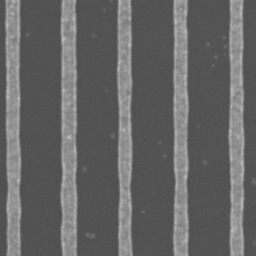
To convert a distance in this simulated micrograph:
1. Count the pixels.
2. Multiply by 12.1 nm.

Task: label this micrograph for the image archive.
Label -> wiring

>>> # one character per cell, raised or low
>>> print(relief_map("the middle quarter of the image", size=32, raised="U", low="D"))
UUUDDDDDDDDDDDUUUDDDDDDDDDDDUUUD
UUUDDDDDDDDDDDUUUDDDDDDDDDDDUUUD
UUUDDDDDDDDDDDUUUDDDDDDDDDDDUUUD
UUUDDDDDDDDDDDUUUDDDDDDDDDDDUUDD
UUUDDDDDDDDDDDUUUDDDDDDDDDDDUUDD
UUUDDDDDDDDDDDUUUDDDDDDDDDDDUUDD
UUUDDDDDDDDDDDUUUDDDDDDDDDDDUUUD
UUUDDDDDDDDDDDUUUDDDDDDDDDDDUUUD
UUUDDDDDDDDDDDUUUDDDDDDDDDDDUUUD
UUUDDDDDDDDDDDUUUDDDDDDDDDDDUUUD
UUUDDDDDDDDDDDUUDDDDDDDDDDDDUUUD
UUUDDDDDDDDDDDUUDDDDDDDDDDDDUUUD
UUUDDDDDDDDDDDUUDDDDDDDDDDDDUUUD
UUUDDDDDDDDDDDUUDDDDDDDDDDDDUUUD
UUUDDDDDDDDDDDUUUDDDDDDDDDDDUUUD
UUUDDDDDDDDDDDUUUDDDDDDDDDDDUUUD
UUUDDDDDDDDDDDUUUDDDDDDDDDDDUUUD
UUUDDDDDDDDDDDUUUDDDDDDDDDDDUUUD
UUUDDDDDDDDDDDUUUDDDDDDDDDDDUUUD
UUUDDDDDDDDDDDUUUDDDDDDDDDDDUUDD
UUUDDDDDDDDDDDUUUDDDDDDDDDDDUUDD
UUUDDDDDDDDDDDUUUDDDDDDDDDDDUUUD
UUUDDDDDDDDDDDUUUDDDDDDDDDDDUUUD
UUUDDDDDDDDDDDUUUDDDDDDDDDDDUUUD
UUUDDDDDDDDDDDUUUDDDDDDDDDDDUUUD
UUUDDDDDDDDDDDUUUDDDDDDDDDDDUUUD
UUUDDDDDDDDDDDUUUDDDDDDDDDDDUUUD
UUUDDDDDDDDDDDUUUDDDDDDDDDDDUUUD
UUUDDDDDDDDDDDUUUDDDDDDDDDDDUUUD
UUUDDDDDDDDDDDUUDDDDDDDDDDDDUUDD
UUUDDDDDDDDDDDUUDDDDDDDDDDDDUUDD
UUUDDDDDDDDDDDUUDDDDDDDDDDDDUUUD